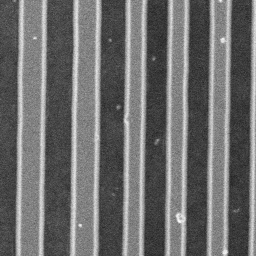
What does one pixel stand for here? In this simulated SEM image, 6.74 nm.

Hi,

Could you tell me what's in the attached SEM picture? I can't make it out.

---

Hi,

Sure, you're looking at groups of lines, slits or small figures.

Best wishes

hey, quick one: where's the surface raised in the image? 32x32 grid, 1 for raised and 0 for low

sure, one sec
00011100001100001100011000111000
00011100011100001100011000111000
00011100011100001100011000111000
00011100011100001100011000111000
00011100001100001100011000111000
00011100001100001100011000111000
00011100011100001100011000111000
00011100011100001100011000111000
00111000011100001100011000110000
00111000011100001100011000110000
00111000011100001100011000110000
00111000011100001100011000110000
00111000011100001100011000110000
00111000011100001100011000110000
00111000011100001100011000110000
00111000011100001100011000110001
00111000011100001100011000110001
00111000011100001100011000110000
00111000011100001100011000110000
00111000011100001100011000110001
00111000011100001100011000110001
00111000011100001100011000110001
00111000011100001100011000110001
00111000011100001100011000110001
00111000011100001100011000110001
00111000011100001100011000110001
00111000011100001100011000110001
00111000011100001100011000110001
00111000011100001100011000110001
00111000011100001100011000110001
00111000011100001100011000110001
00111000011100001100011000110001